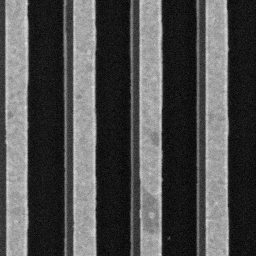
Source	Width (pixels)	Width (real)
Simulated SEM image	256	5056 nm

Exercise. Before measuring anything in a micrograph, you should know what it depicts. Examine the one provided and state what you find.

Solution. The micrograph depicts lines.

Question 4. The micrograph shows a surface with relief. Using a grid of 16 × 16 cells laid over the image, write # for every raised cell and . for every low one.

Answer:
##..##..##..##..
##..##..##..##..
##..##..##..##..
##..##..##..##..
##..##..##..##..
##..##..##..##..
##..##..##..##..
##..##..##..##..
##..##..##..##..
##..##..##..##..
##..##..##..##..
##..##..##..##..
##..##..##..##..
##..##..##..##..
##..##..##..##..
##..##..##..##..